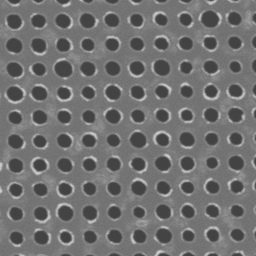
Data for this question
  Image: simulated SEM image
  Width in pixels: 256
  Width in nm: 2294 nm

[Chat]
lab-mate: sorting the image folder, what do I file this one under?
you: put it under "a regular array of holes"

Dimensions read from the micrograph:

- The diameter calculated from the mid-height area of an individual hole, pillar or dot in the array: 0.123 µm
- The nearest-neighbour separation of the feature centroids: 23.9 pixels